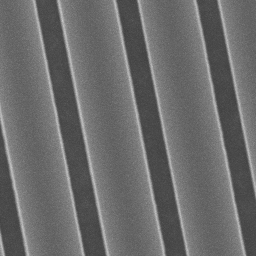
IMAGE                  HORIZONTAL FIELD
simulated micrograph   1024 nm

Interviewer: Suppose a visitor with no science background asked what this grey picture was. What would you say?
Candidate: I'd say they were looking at one or a few lines or trenches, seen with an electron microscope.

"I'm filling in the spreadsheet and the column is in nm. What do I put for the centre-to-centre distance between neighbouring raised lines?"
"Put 316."